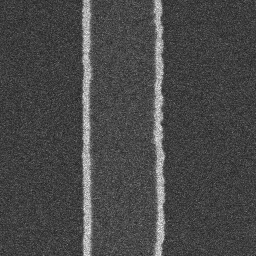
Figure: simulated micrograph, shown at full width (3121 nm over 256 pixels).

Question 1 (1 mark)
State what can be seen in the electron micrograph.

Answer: one or a few lines or trenches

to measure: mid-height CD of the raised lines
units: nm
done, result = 885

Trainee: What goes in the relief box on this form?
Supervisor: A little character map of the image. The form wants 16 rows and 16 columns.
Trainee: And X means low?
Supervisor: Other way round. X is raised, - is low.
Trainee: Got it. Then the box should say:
-----XXXXX------
-----XXXXX------
-----XXXXX------
-----XXXXX------
-----XXXXX------
-----XXXXX------
-----XXXXX------
-----XXXXX------
-----XXXXX------
-----XXXXX------
-----XXXXX------
-----XXXXX------
-----XXXXX------
-----XXXXX------
-----XXXXX------
-----XXXXX------